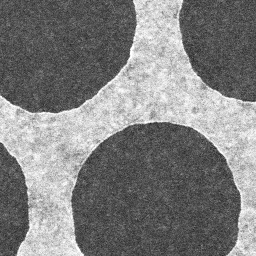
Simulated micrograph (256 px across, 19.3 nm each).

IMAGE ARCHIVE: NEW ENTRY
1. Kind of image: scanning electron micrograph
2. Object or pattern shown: holes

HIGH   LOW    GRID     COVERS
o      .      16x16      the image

........ooo.....
.........oo.....
........ooo.....
........oooo....
........oooo....
......ooooooo...
o....ooooooooooo
oooooooooooooooo
ooooooo......ooo
.ooooo........oo
.oooo.........oo
..ooo..........o
..oo...........o
..ooo..........o
..ooo..........o
.oooo..........o